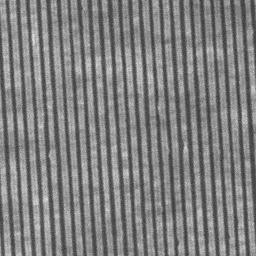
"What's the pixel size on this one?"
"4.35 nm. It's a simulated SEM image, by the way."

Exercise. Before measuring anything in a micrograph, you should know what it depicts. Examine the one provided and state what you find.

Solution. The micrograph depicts parallel lines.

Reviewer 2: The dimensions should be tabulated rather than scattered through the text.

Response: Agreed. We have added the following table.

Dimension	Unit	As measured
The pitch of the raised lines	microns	0.0443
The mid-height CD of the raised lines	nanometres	23.9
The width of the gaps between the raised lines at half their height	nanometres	20.1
